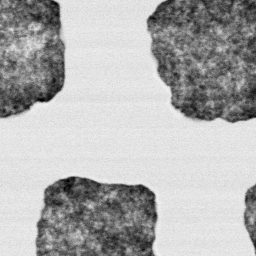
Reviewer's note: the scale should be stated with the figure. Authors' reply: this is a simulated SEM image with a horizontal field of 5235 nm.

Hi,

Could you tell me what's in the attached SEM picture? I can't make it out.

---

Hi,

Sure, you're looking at holes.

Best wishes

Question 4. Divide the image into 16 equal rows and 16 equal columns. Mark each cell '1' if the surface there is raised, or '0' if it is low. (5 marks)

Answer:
0000111111000000
0000111110000000
0000111110000000
0000111111000000
0000111111000000
0000111111100000
0011111111100000
1111111111110101
1111111111111111
1111111111111111
1111111111111111
1110000011111111
1110000000111110
1100000000111110
1100000000111110
1100000000111111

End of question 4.